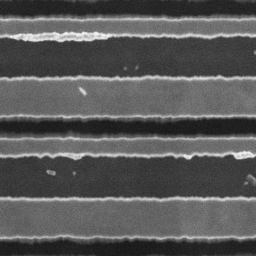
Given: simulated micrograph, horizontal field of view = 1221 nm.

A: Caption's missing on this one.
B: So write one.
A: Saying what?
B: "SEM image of lines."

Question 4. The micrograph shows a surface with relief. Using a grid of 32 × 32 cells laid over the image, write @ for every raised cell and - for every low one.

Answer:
--------------------------------
--------------------------------
@@@@@@@@@@@@@@@@@@@@@@@@@@@@@@@@
@@@@@@@@@@@@@@@@@@@@@@@@@@@@@@@@
@@@@@@@@@@@@@@--@@@@@@@@@@@-@--@
--------------------------------
--------------------------------
--------------------------------
--------------------------------
--------------------------------
@@@@@@@@@@@@@@@@@@@@@@@@@@@@@@@@
@@@@@@@@@@@@@@@@@@@@@@@@@@@@@@@@
@@@@@@@@@@@@@@@@@@@@@@@@@@@@@@@@
@@@@@@@@@@@@@@@@@@@@@@@@@@@@@@@@
@@@@@@@@@@@@@@@@@@@@@@@@@@@@@@-@
--------------------------------
--------------------------------
@@@@@@@@@@@@@@@@@@@@@@@@@@@@@@@@
@@@@@@@@@@@@@@@@@@@@@@@@@@@@@@@@
@@@---@-@@------@@@@@-@@---@-@@@
--------------------------------
--------------------------------
--------------------------------
--------------------------------
--------------------------------
@@@@@@@@@@@@@@@@@@@@@@@@@@@@@@@@
@@@@@@@@@@@@@@@@@@@@@@@@@@@@@@@@
@@@@@@@@@@@@@@@@@@@@@@@@@@@@@@@@
@@@@@@@@@@@@@@@@@@@@@@@@@@@@@@@@
@@@@@@@@@@@@@@@@@@@@@@@@@@@@@@@@
--------------------------------
--------------------------------